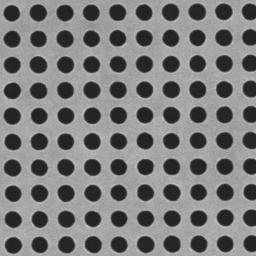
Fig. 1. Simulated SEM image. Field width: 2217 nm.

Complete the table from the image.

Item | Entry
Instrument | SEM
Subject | a regular array of holes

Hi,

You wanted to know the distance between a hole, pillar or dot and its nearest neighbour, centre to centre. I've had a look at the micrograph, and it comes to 222 nm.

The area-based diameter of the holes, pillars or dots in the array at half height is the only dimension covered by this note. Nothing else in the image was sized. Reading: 146 nm